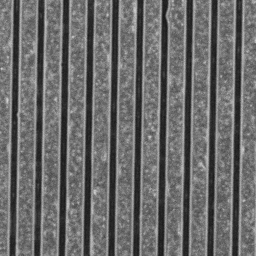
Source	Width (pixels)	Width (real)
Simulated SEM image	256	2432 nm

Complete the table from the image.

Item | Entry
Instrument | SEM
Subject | parallel lines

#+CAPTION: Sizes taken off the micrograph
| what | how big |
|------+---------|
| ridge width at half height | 163 nanometers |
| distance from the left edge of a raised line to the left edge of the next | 235 nm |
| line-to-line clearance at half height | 7.62 pixels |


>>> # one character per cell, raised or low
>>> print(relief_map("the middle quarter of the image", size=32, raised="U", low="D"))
DUUUUDDDUUUUDDUUUUDDUUUUDDUUUUDD
DUUUUDDDUUUUDDUUUUDDUUUUDDUUUUDD
DUUUUDDDUUUUDDUUUUDDUUUUDDUUUUDD
DUUUUDDUUUUUDDUUUUDDUUUUDDUUUUDD
DUUUUDDUUUUUDDUUUUDDUUUUDDUUUUDD
DUUUUDDUUUUDDDUUUUDDUUUUDDUUUUDD
DUUUUDDUUUUDDDUUUUDDUUUUDDUUUUDD
DUUUUDDUUUUDDDUUUUDDUUUUDDUUUUDD
DUUUUDDUUUUDDDUUUUDDUUUUDDUUUUDD
DUUUUDDUUUUDDDUUUUDDUUUUDDUUUUDD
DUUUUDDUUUUDDDUUUUDDUUUUDDUUUUDD
DUUUUDDUUUUDDDUUUUDDUUUUDDUUUUDD
DUUUUDDUUUUDDDUUUUDDUUUUDDUUUUDD
DUUUUDDUUUUDDUUUUUDDUUUUDDUUUUDD
DUUUUDDUUUUDDUUUUUDDUUUUDDUUUUDD
DUUUUDDUUUUDDUUUUDDDUUUUDDUUUUDD
DUUUUDDUUUUDDUUUUDDDUUUUDDUUUUDD
DUUUUDDUUUUDDUUUUDDDUUUUDDUUUUDD
DUUUUDDUUUUDDUUUUDDDUUUUDDUUUUDD
DUUUUDDUUUUDDUUUUDDDUUUUDDUUUUDD
DUUUUDDUUUUDDUUUUDDDUUUUDDUUUUDD
DUUUUDDUUUUDDUUUUDDDUUUUDDUUUUDD
DUUUUDDUUUUDDUUUUDDDUUUUDDUUUUDD
DUUUUDDUUUUDDUUUUDDUUUUUDDUUUUDD
DUUUUDDUUUUDDUUUUDDUUUUUDDUUUUDD
DUUUUDDUUUUDDUUUUDDUUUUDDDUUUUDD
DUUUUDDUUUUDDUUUUDDUUUUDDDUUUUDD
DUUUUDDUUUUDDUUUUDDUUUUDDDUUUUDD
DUUUUDDUUUUDDUUUUDDUUUUDDDUUUUDD
DUUUUDDUUUUDDUUUUDDUUUUDDDUUUUDD
DUUUUDDUUUUDDUUUUDDUUUUDDDUUUUDD
DUUUUDDUUUUDDUUUUDDUUUUDDDUUUUDD